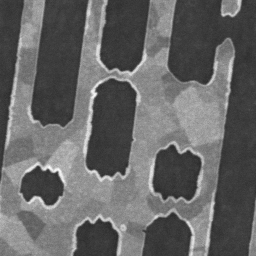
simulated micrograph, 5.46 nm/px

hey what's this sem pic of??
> one or a few lines or trenches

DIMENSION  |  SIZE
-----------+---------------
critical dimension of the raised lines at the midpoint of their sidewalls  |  110 nm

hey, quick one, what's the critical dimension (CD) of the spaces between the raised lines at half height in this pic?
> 0.238 micrometres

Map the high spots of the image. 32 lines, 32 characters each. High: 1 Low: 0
00011100000110000001110000001100
00011000000110000001110000001100
00011000000110000001100000000000
00011000000110000011100000000000
00011000000110000011100000000000
00111000001110000011100000001000
00111000001100000011100000011000
00111000001110000011100000011000
00110000001110000111100000011000
00110000001111111111110000011000
00110000001100001111111110111000
00110000001100000111111111111000
01110000001100000111111111110000
01110000011100000111111111110000
01110000011100000111111111110000
01111000111000000111111111110000
01111111111000000111111111110000
01111111111000000111111111110000
01111111111000001111101111110000
01111111111000001110000001110000
11111111111000001110000001100000
11110001111100001110000001100000
11100000111111111110000001100000
11000000111111111110000001100000
11100000111111111111000011100000
11111101111111111111111111100000
11111111111111111111111111100000
11111111111101111110000111100000
11111111110000111100000011000000
11111111100000011100000011000001
11111111110000011100000011000001
11111111100000011100000011000001